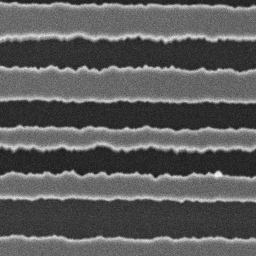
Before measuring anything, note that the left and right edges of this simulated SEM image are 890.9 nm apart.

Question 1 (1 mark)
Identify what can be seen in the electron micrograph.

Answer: lines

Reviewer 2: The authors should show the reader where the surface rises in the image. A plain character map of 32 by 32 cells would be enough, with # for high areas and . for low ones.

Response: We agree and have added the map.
###...##.....#..................
################################
################################
################################
######.##.######################
................................
................................
................................
#..#..#...#...#...##.#..........
################################
################################
################################
#......#########################
................................
................................
................................
################################
################################
.#.####.###...####..############
................................
................................
........#.......................
################################
################################
################################
................................
................................
................................
................................
................................
################################
################################